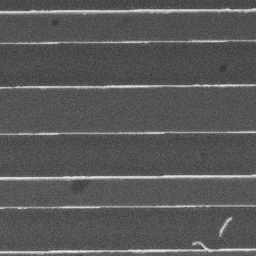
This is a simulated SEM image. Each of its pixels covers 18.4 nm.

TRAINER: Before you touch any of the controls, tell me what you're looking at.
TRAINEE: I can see lines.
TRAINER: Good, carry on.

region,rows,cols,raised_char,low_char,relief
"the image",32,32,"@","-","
--------------------------------
@@@@@@@@@@@@@@@@@@@@@@@@@@@@@@@@
@@@@@@@@@@@@@@@@@@@@@@@@@@@@@@@@
@@@@@@@@@@@@@@@@@@@@@@@@@@@@@@@@
@@@@@@@@@@@@@@@@@@@@@@@@@@@@@@@@
--------------------------------
--------------------------------
--------------------------------
--------------------------------
--------------------------------
--------------------------------
@@@@@@@@@@@@@@@@@@@@@@@@@@@@@@@@
@@@@@@@@@@@@@@@@@@@@@@@@@@@@@@@@
@@@@@@@@@@@@@@@@@@@@@@@@@@@@@@@@
@@@@@@@@@@@@@@@@@@@@@@@@@@@@@@@@
@@@@@@@@@@@@@@@@@@@@@@@@@@@@@@@@
@@@@@@@@@@@@@@@@@@@@@@@@@@@@@@@@
--------------------------------
--------------------------------
--------------------------------
--------------------------------
--------------------------------
@@@@@@@@@@@@@@@@@@@@@@@@@@@@@@@@
@@@@@@@@@@@@@@@@@@@@@@@@@@@@@@@@
@@@@@@@@@@@@@@@@@@@@@@@@@@@@@@@@
@@@@@@@@@@@@@@@@@@@@@@@@@@@@@@@@
--------------------------------
--------------------------------
--------------------------------
--------------------------------
--------------------------------
-------@@@@@@@@@@@@@@@@@@@@@@@@@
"